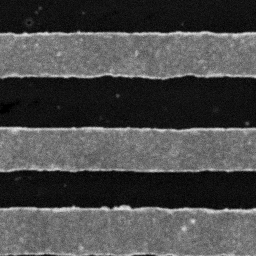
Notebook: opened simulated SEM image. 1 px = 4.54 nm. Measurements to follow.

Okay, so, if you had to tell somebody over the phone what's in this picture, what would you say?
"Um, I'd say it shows lines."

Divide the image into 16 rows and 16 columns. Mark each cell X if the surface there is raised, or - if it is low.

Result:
----------------
----------------
XXXXXXXXXXXXXXXX
XXXXXXXXXXXXXXXX
XXXXXXXXXXXXXXXX
----------------
----------------
----------------
XXXXXXXXXXXXXXXX
XXXXXXXXXXXXXXXX
XXXXXXXXXXXXXXXX
----------------
----------------
XXXXXXXXXXXXXXXX
XXXXXXXXXXXXXXXX
XXXXXXXXXXXXXXXX